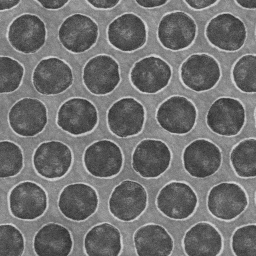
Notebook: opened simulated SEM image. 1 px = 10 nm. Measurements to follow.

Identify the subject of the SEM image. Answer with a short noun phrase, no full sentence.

a regular array of holes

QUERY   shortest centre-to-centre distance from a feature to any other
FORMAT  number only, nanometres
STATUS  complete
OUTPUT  479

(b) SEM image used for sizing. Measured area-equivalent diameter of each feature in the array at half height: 39.1 pixels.